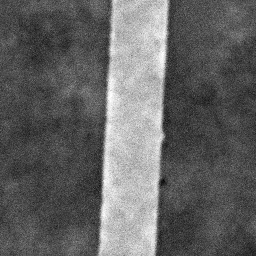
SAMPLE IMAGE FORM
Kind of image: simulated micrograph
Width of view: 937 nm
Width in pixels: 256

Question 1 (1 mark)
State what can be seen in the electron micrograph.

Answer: one or a few lines or trenches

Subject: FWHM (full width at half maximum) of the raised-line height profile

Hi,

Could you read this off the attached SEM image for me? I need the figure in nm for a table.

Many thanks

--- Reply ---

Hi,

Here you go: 190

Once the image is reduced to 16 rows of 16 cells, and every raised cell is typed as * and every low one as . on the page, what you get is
.......***......
.......***......
.......***......
.......***......
.......***......
.......***......
.......***......
.......***......
.......***......
.......***......
.......***......
.......***......
.......***......
......****......
......****......
......****......